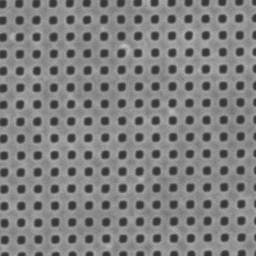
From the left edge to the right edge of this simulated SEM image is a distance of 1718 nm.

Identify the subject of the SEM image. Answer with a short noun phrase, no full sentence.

a regular array of holes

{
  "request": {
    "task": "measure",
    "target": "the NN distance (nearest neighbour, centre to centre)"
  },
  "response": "0.111 microns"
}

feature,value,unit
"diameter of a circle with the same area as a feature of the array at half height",61.1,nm